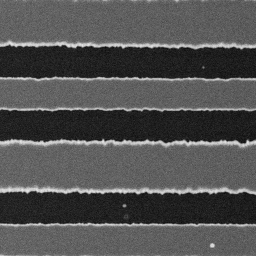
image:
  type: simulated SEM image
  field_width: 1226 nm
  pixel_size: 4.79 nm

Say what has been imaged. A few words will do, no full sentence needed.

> lines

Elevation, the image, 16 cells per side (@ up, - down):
@@@@@@@@@@@@@@@@
@@@@@@@@@@@@@@@@
@@@@@@@@@@@@@@@@
----------------
----------------
@@@@@@@@@@@@@@@@
@@@@@@@@@@@@@@@@
----------------
----------------
@@@@@@@@@@@@@@@@
@@@@@@@@@@@@@@@@
@@@@@@@@@@@@@@@@
----------------
----------------
@@@@@@@@@@@@@@@@
@@@@@@@@@@@@@@@@